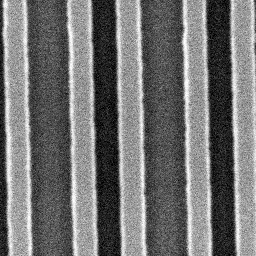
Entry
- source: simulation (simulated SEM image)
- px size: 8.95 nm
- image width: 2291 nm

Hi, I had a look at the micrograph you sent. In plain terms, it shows lines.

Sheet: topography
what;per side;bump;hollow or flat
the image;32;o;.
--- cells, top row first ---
.oo......oo....oo......ooo...ooo
.oo......oo....oo......ooo...ooo
.oo......oo....oo......ooo...ooo
.oo......oo....oo......ooo...ooo
.oo......oo....ooo.....ooo...ooo
.oo......oo....oo......ooo...ooo
.oo......oo....ooo.....ooo...ooo
.oo......oo....ooo.....ooo...ooo
.oo......oo....ooo.....ooo...ooo
.oo......oo....ooo.....ooo...ooo
.oo......ooo...ooo.....ooo...ooo
.oo......ooo...ooo.....ooo...ooo
.oo......ooo...ooo.....ooo...ooo
.ooo.....ooo...ooo.....ooo...ooo
.ooo.....ooo...ooo.....ooo...ooo
.ooo.....ooo...ooo.....ooo...ooo
.ooo.....ooo...ooo.....ooo...ooo
.ooo.....ooo...ooo.....ooo...ooo
.ooo.....ooo...ooo.....ooo...ooo
.ooo.....ooo...ooo.....ooo...ooo
.ooo.....ooo...ooo.....ooo...ooo
.ooo.....ooo...ooo.....ooo...ooo
.ooo.....ooo...ooo.....ooo...ooo
.ooo.....ooo...ooo.....ooo...ooo
.ooo.....ooo...ooo.....ooo...ooo
.ooo.....ooo...ooo.....ooo....oo
.ooo.....ooo...ooo......oo...ooo
.ooo.....ooo...ooo......oo....oo
.ooo.....ooo...ooo......oo....oo
.ooo.....ooo...ooo......oo....oo
.ooo.....ooo...ooo......oo....oo
.ooo.....ooo...ooo......oo....oo